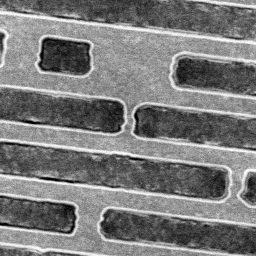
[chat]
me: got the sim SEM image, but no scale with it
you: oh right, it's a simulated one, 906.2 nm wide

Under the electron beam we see parallel lines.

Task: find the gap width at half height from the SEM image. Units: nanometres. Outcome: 123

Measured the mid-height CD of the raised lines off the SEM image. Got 69.5 nm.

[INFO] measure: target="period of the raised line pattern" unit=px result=53.4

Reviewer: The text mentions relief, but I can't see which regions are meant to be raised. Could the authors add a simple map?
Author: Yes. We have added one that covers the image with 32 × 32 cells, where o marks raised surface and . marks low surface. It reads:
............................oooo
................................
oooooooo........................
oooooooooooooooo................
.oooooooooooooooooooooooo.......
ooooo......ooooooooooooooooooooo
ooooo......ooooooooooooooooooooo
ooooo......ooooooooooo........oo
ooooo......ooooooooooo..........
ooooooooooooooooooooo...........
oooooooooooooooooooooo..........
......oooooooooooooooooooo......
..............oooooooooooooooooo
................o......ooooooooo
................o..............o
ooo............oo...............
ooooooooooo....oo...............
oooooooooooooooooooo............
........ooooooooooooooooooo.....
.................ooooooooooooooo
........................oooooooo
.............................oo.
ooooo........................oo.
ooooooooooooo................o..
.oooooooooooooooooooo.......oo..
.........oooooooooooooooooooooo.
..........ooo.....oooooooooooooo
..........ooo.............oooooo
oo.......ooo....................
ooooooooooooo...................
oooooooooooooooooo..............
........oooooooooooooooooo......